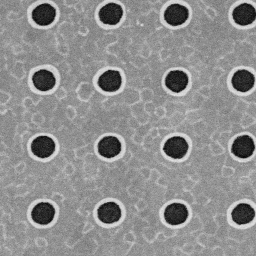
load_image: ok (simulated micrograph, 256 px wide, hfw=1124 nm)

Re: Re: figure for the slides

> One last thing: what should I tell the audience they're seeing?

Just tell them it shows a regular array of holes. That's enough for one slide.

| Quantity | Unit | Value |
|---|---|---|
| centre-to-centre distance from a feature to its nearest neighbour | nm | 290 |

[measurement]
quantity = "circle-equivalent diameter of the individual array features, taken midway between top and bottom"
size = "26.7 pixels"